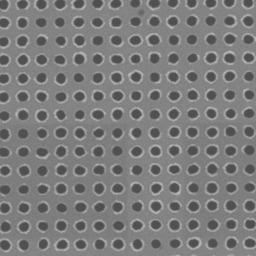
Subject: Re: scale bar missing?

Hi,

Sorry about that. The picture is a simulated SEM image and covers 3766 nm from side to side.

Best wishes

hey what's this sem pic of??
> a regular array of holes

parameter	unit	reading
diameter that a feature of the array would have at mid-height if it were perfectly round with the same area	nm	141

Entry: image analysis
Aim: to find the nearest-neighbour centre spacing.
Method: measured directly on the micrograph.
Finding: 268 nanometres